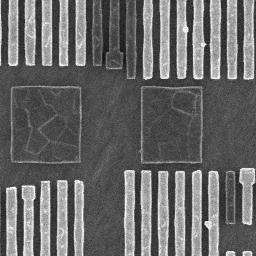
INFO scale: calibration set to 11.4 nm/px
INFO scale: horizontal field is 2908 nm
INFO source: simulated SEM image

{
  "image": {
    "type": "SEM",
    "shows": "wiring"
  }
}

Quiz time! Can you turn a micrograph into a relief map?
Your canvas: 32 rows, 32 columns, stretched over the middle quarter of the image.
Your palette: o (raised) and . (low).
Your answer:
...........oooo.oo..oo..oo..ooo.
................oo..oo..oo..ooo.
................oo..oo..oo..oo..
....................o...........
................................
................................
oooo................oooooooooooo
oooo................oooooooooooo
oooo................oooooooooooo
oooo................oooooooooooo
oooo................oooooooooooo
oooo................oooooooooooo
oooo................oooooooooooo
oooo................oooooooooooo
oooo................oooooooooooo
oooo................oooooooooooo
oooo................oooooooooooo
oooo................oooooooooooo
oooo................oooooooooooo
oooo................oooooooooooo
oooo................oooooooooooo
oooo...............ooooooooooooo
oooo...............ooooooooooooo
oooo................oooooooooooo
o...................oooooo....oo
................................
................................
...............ooo..oo..oo..oo..
...............ooo..oo..oo..oo..
o..o...........ooo..oo..oo..oo..
o..oo..........ooo..oo..oo..oo..
o..oo..........ooo.ooo..oo..oo..